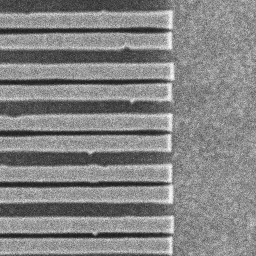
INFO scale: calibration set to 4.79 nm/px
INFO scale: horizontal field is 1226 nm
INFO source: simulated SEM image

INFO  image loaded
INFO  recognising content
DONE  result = parallel lines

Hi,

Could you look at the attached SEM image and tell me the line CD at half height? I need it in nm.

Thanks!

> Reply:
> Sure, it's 77.8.